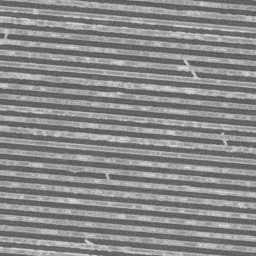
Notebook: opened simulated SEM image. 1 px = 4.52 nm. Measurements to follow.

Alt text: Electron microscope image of parallel lines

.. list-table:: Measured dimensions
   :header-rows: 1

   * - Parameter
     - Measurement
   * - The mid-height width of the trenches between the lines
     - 26.4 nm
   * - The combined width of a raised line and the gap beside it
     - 49.4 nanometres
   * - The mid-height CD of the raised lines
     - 21.9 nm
